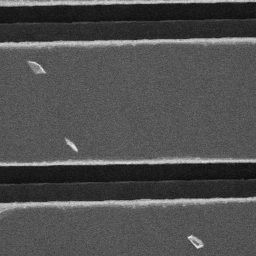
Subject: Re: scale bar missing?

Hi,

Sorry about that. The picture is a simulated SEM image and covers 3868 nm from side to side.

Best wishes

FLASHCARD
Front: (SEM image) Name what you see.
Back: lines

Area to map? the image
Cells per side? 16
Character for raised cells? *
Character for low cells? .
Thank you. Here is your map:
................
................
........********
****************
****************
****************
****************
****************
****************
****************
................
................
...........*****
****************
****************
****************